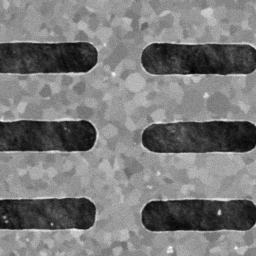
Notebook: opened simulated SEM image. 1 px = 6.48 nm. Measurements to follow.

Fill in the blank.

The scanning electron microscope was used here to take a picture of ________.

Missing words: holes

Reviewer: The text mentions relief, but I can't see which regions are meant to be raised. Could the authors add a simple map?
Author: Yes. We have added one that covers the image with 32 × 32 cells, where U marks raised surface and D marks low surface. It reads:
UUUUUUUUUUUUUUUUUUUUUUUUUUUUUUUU
UUUUUUUUUUUUUUUUUUUUUUUUUUUUUUUU
UUUUUUUUUUUUUUUUUUUUUUUUUUUUUUUU
UUUUUUUUUUUUUUUUUUUUUUUUUUUUUUUU
UUUUUUUUUUUUUUUUUUUUUUUUUUUUUUUU
DDDDDDDDDDDUUUUUUUUDDDUDDUDDDDDU
DDDDDDDDDDDDUUUUUUDDDDDDDDDDDDDD
DDDDDDDDDDDDUUUUUUDDDDDDDDDDDDDD
DDDDDDDDDDDDUUUUUUDDDDDDDDDDDDDD
UUUUUUUUUUUUUUUUUUUUUUUUUUUUUUUU
UUUUUUUUUUUUUUUUUUUUUUUUUUUUUUUU
UUUUUUUUUUUUUUUUUUUUUUUUUUUUUUUU
UUUUUUUUUUUUUUUUUUUUUUUUUUUUUUUU
UUUUUUUUUUUUUUUUUUUUUUUUUUUUUUUU
UUUUUUUUUUUUUUUUUUUUUUUUUUUUUUUU
DDDDDDDDDDDUUUUUUUUDDDDDDDDDDDDD
DDDDDDDDDDDDUUUUUUDDDDDDDDDDDDDD
DDDDDDDDDDDDUUUUUUDDDDDDDDDDDDDD
DDDDDDDDDDDUUUUUUUDDDDDDDDDDDDDD
UUUUUUUUUUUUUUUUUUUUUUUUUUUUUUUU
UUUUUUUUUUUUUUUUUUUUUUUUUUUUUUUU
UUUUUUUUUUUUUUUUUUUUUUUUUUUUUUUU
UUUUUUUUUUUUUUUUUUUUUUUUUUUUUUUU
UUUUUUUUUUUUUUUUUUUUUUUUUUUUUUUU
UUUUUUUUUUUUUUUUUUUUUUUUUUUUUUUU
DDDDDDDDDDDDUUUUUUDDDDDDDDDDDDDD
DDDDDDDDDDDDUUUUUUDDDDDDDDDDDDDD
DDDDDDDDDDDDUUUUUUDDDDDDDDDDDDDD
DDDDDDDDDDDUUUUUUUDDDDDDDDDDDDDU
UUUUUUUUUUUUUUUUUUUUUUUUUUUUUUUU
UUUUUUUUUUUUUUUUUUUUUUUUUUUUUUUU
UUUUUUUUUUUUUUUUUUUUUUUUUUUUUUUU